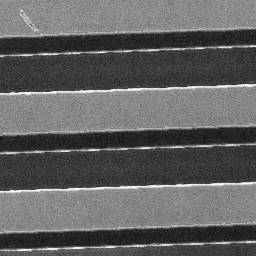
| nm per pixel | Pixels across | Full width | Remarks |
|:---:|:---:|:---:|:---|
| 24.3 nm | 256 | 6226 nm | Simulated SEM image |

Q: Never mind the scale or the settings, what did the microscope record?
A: lines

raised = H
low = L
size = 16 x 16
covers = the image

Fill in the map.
HHHHHHHHHHHHHHHH
HHHHHHHHHHHHHHHH
HHHHHHHHHHHHHHHH
LLLLLLLLLLLLLLLL
LLLLLLLLLLLLLLLL
LLLLLLLLLLHHHHHH
HHHHHHHHHHHHHHHH
HHHHHHHHHHHHHHHH
HHHHHHHHHHHHHHHH
HHHLLLLLLLLLLLLL
LLLLLLLLLLLLLLLL
LLLLLLLLLLLLLHHH
HHHHHHHHHHHHHHHH
HHHHHHHHHHHHHHHH
HHHHHHHHHHHHHHHH
HHHHHLLLLLLLLLLL